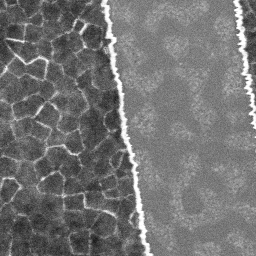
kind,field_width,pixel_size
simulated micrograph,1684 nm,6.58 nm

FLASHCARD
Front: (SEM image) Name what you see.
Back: one or a few lines or trenches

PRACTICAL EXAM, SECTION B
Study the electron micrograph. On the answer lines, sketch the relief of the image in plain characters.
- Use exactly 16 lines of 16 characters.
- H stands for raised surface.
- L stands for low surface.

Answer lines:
HHHHHHHLLLLLLLLH
HHHHHHHLLLLLLLLH
HHHHHHHLLLLLLLLH
HHHHHHHLLLLLLLLH
HHHHHHHLLLLLLLLH
HHHHHHHHLLLLLLLL
HHHHHHHHLLLLLLLL
HHHHHHHHLLLLLLLL
HHHHHHHHLLLLLLLL
HHHHHHHHLLLLLLLL
HHHHHHHHLLLLLLLL
HHHHHHHHLLLLLLLL
HHHHHHHHHLLLLLLL
HHHHHHHHHLLLLLLL
HHHHHHHHHLLLLLLL
HHHHHHHHHLLLLLLL